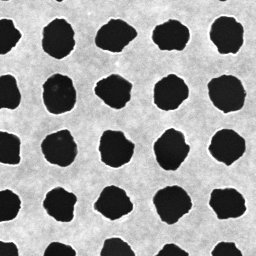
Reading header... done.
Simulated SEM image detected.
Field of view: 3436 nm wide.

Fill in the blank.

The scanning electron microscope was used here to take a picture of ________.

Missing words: a regular array of holes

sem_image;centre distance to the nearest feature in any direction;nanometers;729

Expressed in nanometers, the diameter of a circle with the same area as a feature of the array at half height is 477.